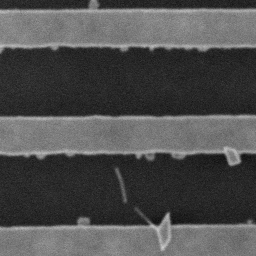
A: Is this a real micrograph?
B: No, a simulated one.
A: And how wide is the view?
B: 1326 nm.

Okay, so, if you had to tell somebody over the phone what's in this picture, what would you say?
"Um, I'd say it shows lines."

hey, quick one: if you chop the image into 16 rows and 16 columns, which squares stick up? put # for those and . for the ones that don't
................
################
################
................
................
................
................
################
################
################
................
................
................
................
################
################